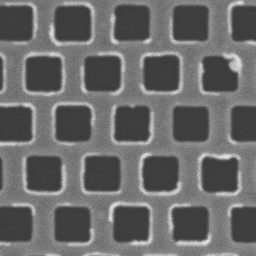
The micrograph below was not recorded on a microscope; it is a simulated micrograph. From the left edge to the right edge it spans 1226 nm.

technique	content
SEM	a regular array of holes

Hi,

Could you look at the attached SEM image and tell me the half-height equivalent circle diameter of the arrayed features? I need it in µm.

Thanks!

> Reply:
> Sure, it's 0.191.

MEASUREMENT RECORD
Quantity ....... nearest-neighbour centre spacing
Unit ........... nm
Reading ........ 276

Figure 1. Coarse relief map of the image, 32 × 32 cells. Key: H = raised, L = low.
HHHHHHHHHHHHHHHHHHHHHHHHHHHHHHHH
LLLLHHHLLLLHHHLLLLLHHHLLLLHHHLLL
LLLLHHHLLLLHHHLLLLLHHLLLLLHHHLLL
LLLLHHHLLLLHHHLLLLLHHLLLLLHHHLLL
LLLLHHHLLLLHHHLLLLLHHHLLLLHHHLLL
HHHHHHHHHHHHHHHHHHHHHHHHHHHHHHHH
HHHHHHHHHHHHHHHHHHHHHHHHHHHHHHHH
HHHLLLLLHHHLLLLHHHLLLLHHHLLLLHHH
HHHLLLLLHHHLLLLHHHLLLLHHHLLLLHHH
HHHLLLLLHHHLLLLHHHLLLLLHHLLLLLHH
HHHLLLLLHHHLLLLHHHLLLLHHHLLLLLHH
HHHHLLLHHHHHLLHHHHHHLHHHHHLLLHHH
HHHHHHHHHHHHHHHHHHHHHHHHHHHHHHHH
LLLLHHHLLLLHHHHLLLHHHHLLLLHHHLLL
LLLLHHHLLLLHHHLLLLLHHHLLLLHHHLLL
LLLLHHHLLLLHHHLLLLLHHHLLLLHHHLLL
LLLLHHHLLLLLHHLLLLLHHHLLLLHHHLLL
LLLLHHHLLLLHHHHLLLHHHHLLLLHHHLLL
HHHHHHHHHHHHHHHHHHHHHHHHHHHHHHHH
HHHHLLLHHHHLLHHHHHHLLLHHHHHHHHHH
HHHLLLLLHHHLLLLHHHLLLLHHHLLLLLHH
HHHLLLLLHHHLLLLHHHLLLLHHHLLLLLHH
HHHLLLLLHHLLLLLHHHLLLLHHHLLLLLHH
HHHLLLLLHHHLLLLHHHLLLLHHHLLLLLHH
HHHHHHHHHHHHHHHHHHHHHHHHHHHHHHHH
HHHHHHHHHHHHHHHHHHHHHHHHHHHHHHHH
LLLLHHHLLLLHHHLLLLLHHHLLLLHHHLLL
LLLLHHHLLLLHHHLLLLLHHHLLLLHHHLLL
LLLLHHHLLLLHHHLLLLLHHHLLLLHHHLLL
LLLLHHHLLLLHHHLLLLLHHHLLLLHHHLLL
HHHHHHHHHHHHHHHHHHHHHHHHHHHHHHHH
HHHHHHHHHHHHHHHHHHHHHHHHHHHHHHHH